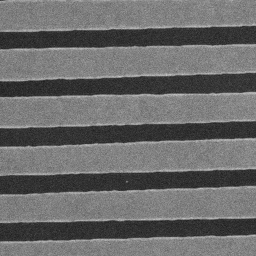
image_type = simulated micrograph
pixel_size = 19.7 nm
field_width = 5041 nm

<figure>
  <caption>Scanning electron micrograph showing lines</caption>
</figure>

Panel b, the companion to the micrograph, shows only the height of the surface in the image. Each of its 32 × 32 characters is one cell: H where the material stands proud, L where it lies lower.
HHHHHHHHHHHHHHHHHHHHHHHHHHHHHHHH
HHHHHHHHHHHHHHHHHHHHHHHHHHHHHHHH
HHHHHHHHHHHHHHHHHHHHHHHHHHHHHHHH
HHHHHHHHHHHHHHHHHHHLLLLLLLLLLLLL
LLLLLLLLLLLLLLLLLLLLLLLLLLLLLLLL
LLLLLLLLLLLLLLLLLLLLLLLLLLLLLLLL
HHHHHHHHHHHHHHHHHHHHHHHHHHHHHHHH
HHHHHHHHHHHHHHHHHHHHHHHHHHHHHHHH
HHHHHHHHHHHHHHHHHHHHHHHHHHHHHHHH
HHHHHHHHHHHHHHHHHHLLLLLLLLLLLLLL
LLLLLLLLLLLLLLLLLLLLLLLLLLLLLLLL
LLLLLLLLLLLLLLLLLLLLLLLLLLLLLLLL
HHHHHHHHHHHHHHHHHHHHHHHHHHHHHHHH
HHHHHHHHHHHHHHHHHHHHHHHHHHHHHHHH
HHHHHHHHHHHHHHHHHHHHHHHHHHHHHHHH
HHHHHHHHHHHHHHHHHHLLLLLLLLLLLLLL
LLLLLLLLLLLLLLLLLLLLLLLLLLLLLLLL
LLLLLLLLLLLLLLLLLLLLLLLLLHHHHHHH
HHHHHHHHHHHHHHHHHHHHHHHHHHHHHHHH
HHHHHHHHHHHHHHHHHHHHHHHHHHHHHHHH
HHHHHHHHHHHHHHHHHHHHHHHHHHHHHHHH
HHHHHHHHHHHHHHLLLLLLLLLLLLLLLLLL
LLLLLLLLLLLLLLLLLLLLLLLLLLLLLLLL
LLLLLLLLLLLLLLLLLLLLLLLLLLLHHHHH
HHHHHHHHHHHHHHHHHHHHHHHHHHHHHHHH
HHHHHHHHHHHHHHHHHHHHHHHHHHHHHHHH
HHHHHHHHHHHHHHHHHHHHHHHHHHHHHHHH
HHHHHHHHHHHHHHHHLLLLLLLLLLLLLLLL
LLLLLLLLLLLLLLLLLLLLLLLLLLLLLLLL
LLLLLLLLLLLLLLLLLLLLLLLLLLLLLLLH
HHHHHHHHHHHHHHHHHHHHHHHHHHHHHHHH
HHHHHHHHHHHHHHHHHHHHHHHHHHHHHHHH